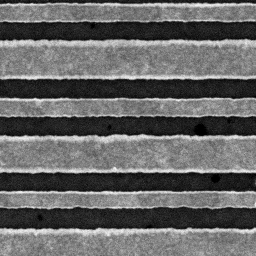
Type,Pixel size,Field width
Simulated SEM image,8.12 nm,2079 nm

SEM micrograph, lines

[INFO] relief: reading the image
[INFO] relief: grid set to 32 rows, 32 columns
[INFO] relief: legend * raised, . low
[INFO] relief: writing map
......******.**....*............
********************************
********************************
................................
................................
********************************
********************************
********************************
********************************
********************************
................................
................................
********************************
********************************
****.****.*...*......****...*.*.
................................
................................
********************************
********************************
********************************
********************************
...**.*.******.**.*.****.*******
................................
................................
********************************
********************************
................................
................................
................................
********************************
********************************
********************************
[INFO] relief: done